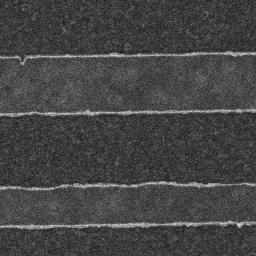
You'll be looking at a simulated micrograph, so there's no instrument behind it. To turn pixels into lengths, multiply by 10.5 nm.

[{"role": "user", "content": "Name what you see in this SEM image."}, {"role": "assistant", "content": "one or a few lines or trenches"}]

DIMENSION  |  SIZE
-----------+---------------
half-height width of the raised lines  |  0.772 um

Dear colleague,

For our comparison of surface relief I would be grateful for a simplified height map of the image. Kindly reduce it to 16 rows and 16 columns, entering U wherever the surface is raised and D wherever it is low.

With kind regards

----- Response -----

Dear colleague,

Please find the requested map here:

UUUUUUUUUUUUUUUU
UUUUUUUUUUUUUUUU
UUUUUUUUUUUUUUUU
UUUUUUDUDDDDDDDD
DDDDDDDDDDDDDDDD
DDDDDDDDDDDDDDDD
DDDDDDDDDDDDDDDD
UUUUUUUUUUUUUUUU
UUUUUUUUUUUUUUUU
UUUUUUUUUUUUUUUU
UUUUUUUUUUUUUUUU
UUUUUUUUUDUUUUUU
DDDDDDDDDDDDDDDD
DDDDDDDDDDDDDDDD
UUUUUUUUUUUUUUUU
UUUUUUUUUUUUUUUU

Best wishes